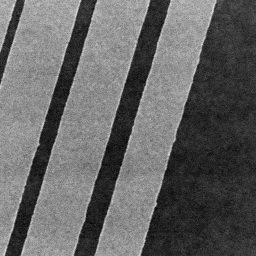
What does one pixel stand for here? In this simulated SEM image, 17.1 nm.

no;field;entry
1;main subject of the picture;one or a few lines or trenches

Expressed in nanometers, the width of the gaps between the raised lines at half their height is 280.